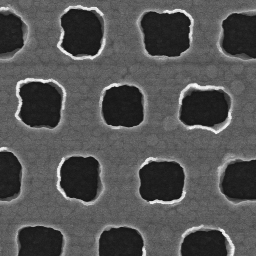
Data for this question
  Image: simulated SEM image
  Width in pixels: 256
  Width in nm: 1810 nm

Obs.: holes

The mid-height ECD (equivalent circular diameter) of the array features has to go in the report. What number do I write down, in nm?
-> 318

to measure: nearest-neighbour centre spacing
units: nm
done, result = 579